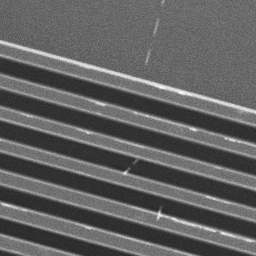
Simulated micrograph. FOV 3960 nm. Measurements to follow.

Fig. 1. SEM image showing parallel lines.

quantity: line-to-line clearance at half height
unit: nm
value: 259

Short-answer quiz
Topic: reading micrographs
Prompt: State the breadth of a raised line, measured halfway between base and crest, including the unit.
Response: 222 nanometres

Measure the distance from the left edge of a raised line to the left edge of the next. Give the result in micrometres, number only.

0.478